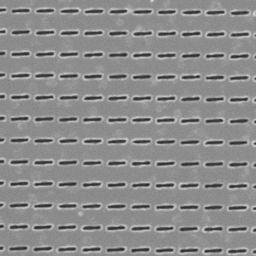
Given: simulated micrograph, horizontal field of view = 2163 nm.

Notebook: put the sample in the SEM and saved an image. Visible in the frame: a regular array of holes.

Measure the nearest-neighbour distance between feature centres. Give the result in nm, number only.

182